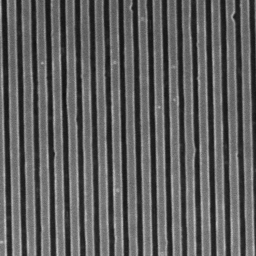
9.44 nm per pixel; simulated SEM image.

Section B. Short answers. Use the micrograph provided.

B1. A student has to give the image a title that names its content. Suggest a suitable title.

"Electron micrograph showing parallel lines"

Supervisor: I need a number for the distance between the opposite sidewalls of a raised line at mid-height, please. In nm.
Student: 79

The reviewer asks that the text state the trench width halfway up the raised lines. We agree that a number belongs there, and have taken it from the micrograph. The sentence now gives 53.1 nanometers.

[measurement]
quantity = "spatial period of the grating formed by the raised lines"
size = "138 nm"